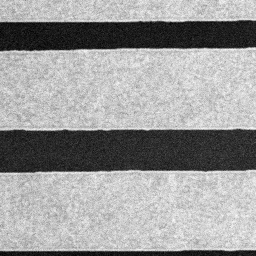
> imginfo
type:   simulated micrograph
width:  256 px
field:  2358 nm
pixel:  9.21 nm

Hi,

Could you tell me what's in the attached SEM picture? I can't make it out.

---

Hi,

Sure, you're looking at lines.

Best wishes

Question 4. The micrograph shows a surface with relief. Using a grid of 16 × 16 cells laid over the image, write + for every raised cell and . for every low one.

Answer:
++++++++++++++++
................
................
++++++++++++++++
++++++++++++++++
++++++++++++++++
++++++++++++++++
++++++++++++++++
................
................
................
++++++++++++++++
++++++++++++++++
++++++++++++++++
++++++++++++++++
++++++++++++++++